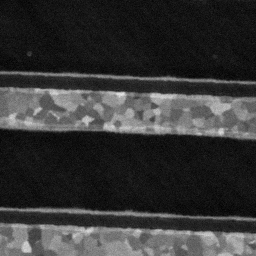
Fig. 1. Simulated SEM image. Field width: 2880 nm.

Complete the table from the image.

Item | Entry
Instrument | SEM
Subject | lines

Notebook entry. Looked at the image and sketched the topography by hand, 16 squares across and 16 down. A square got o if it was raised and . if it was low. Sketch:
................
................
................
................
................
oo..............
oooooooooooooooo
oooooooooooooooo
................
................
................
................
................
................
ooooooooooooo...
oooooooooooooooo